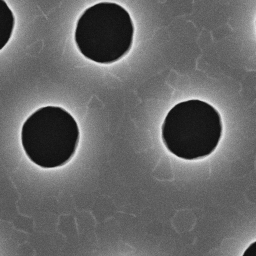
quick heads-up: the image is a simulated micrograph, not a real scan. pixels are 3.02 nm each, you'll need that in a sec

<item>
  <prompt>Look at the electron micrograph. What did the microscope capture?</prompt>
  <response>holes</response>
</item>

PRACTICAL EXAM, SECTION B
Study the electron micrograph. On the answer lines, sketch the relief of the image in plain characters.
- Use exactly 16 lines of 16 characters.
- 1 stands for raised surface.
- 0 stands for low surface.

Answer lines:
0111110011111111
0111100011111111
1111100011111111
1111100011111111
1111111111111111
1111111111111111
1111111111100111
1100011111000011
1000011111000011
1100011111100111
1111111111111111
1111111111111111
1111111111111111
1111111111111111
1111111111111111
1111111111111111